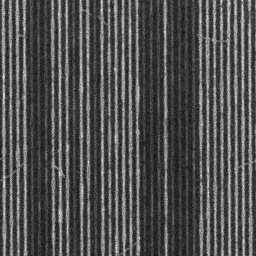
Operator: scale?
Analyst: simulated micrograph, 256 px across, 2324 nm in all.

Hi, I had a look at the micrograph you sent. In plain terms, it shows parallel lines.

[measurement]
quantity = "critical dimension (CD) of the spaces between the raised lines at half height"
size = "0.0465 µm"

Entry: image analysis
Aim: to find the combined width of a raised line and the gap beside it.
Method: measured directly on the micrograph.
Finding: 63.9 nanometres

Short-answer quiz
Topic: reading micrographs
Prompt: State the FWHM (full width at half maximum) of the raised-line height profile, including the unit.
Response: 19.3 nm